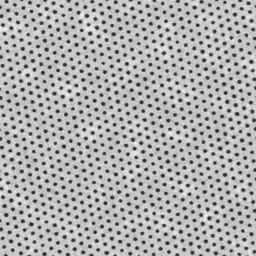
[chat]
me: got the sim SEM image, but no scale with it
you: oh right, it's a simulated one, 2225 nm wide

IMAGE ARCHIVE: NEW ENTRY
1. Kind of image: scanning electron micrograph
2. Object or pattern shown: a regular array of holes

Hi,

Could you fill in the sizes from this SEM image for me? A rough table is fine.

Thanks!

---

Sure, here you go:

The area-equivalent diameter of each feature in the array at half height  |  35.4 nm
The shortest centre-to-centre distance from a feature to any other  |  74.9 nanometers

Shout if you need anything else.